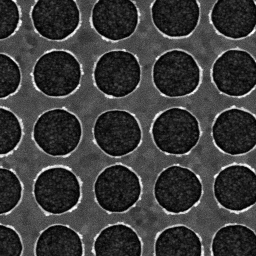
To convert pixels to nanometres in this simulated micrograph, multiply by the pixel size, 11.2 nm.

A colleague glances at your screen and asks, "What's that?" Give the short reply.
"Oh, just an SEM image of a regular array of holes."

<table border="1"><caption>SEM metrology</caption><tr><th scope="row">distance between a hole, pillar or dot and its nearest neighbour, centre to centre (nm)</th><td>647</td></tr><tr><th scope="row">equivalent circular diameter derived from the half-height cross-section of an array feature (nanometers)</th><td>523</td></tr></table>